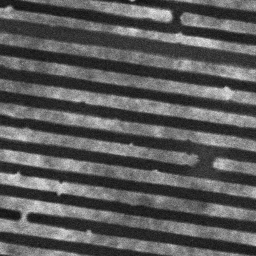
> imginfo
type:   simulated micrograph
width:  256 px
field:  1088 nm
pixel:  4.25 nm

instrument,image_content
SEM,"parallel lines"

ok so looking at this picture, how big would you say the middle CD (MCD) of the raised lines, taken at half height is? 0.0531 microns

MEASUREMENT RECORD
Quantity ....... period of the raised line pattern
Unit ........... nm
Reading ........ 98.5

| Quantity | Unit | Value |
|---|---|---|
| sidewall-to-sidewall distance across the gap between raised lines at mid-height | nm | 44.6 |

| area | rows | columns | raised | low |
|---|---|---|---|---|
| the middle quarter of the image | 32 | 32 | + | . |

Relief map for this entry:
++...................+++++++++++
+++++++++...................++++
++++++++++++++++................
..++++++++++++++++++++..........
.........+++++++++++++++++++....
................++++++++++++++++
+++..................+++++++++++
++++++++++..................++++
+++++++++++++++++...............
...+.+++++++++++++++++++........
..........++++++++++++++++++++..
...............+++++++++++++++++
+++...................++++++++++
++++++++++....................++
+++++++++++++++++...............
.++++++++++++++++++++++.+.......
..........+++++++++++++++++++++.
.................+++++++++++++++
+++++..................+++++++++
+++++++++++.....................
++++++++++++++++++..............
......+++++++++++++++++++.......
.............++++++++++++++++++.
..................++++++++++++++
++++++..................++++++++
++++++++++++++.................+
+++++++++++++++++++++...........
.....++++++++++++++++++++++.....
............++++++++++++++++++++
++.................+++++++++++++
++++++++...................+++++
++++++++++++++..................